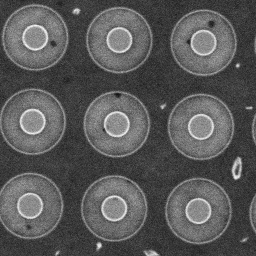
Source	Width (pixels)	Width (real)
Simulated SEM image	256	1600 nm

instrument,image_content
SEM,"an array of small figures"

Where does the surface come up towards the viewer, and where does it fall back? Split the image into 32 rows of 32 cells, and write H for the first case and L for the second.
HHHHHHHHHHHHHHHHHHHHHHHHHHHHHHHH
HHLLLLLHHHHHHLLLLHHHHHHHLLHHHHHH
HLLLLLLLHHHHLLLLLLHHHHHLLLLLHHHH
HLLLHLLLHHHLLLLLLLLHHHLLLLLLLHHH
LLLHHHLLHHHLLLHHLLLHHHLLHHHLLHHH
HLLHHHLLHHHLLHHHLLLHHHLLHHHLLHHH
HLLLLLLLHHHLLLLLLLLHHHLLHHLLLHHH
HHLLLLLHHHHHLLLLLLHHHHLLLLLLLHHH
HHHHLLHHHHHHHLLLLHHHHHHLLLLLHHHH
HHHHHHHHHHHHHHHHHHHHHHHHHHHHHHHH
HHHHHHHHHHHHHHHHHHHHHHHHHHHHHHHH
HHHLLHHHHHHHHHHHHHHHHHHHHHHHHHHH
HLLLLLLHHHHHLLLLLHHHHHHLLLLHHHHH
HLLLLLLLHHHLLLLLLLHHHHLLLLLLHHHH
LLLHHLLLHHHLLHHHLLHHHLLLHHLLLHHH
LLLHHHLLHHHLLHHHLLLHHLLLHHHLLHHH
LLLHHLLLHHHLLHHHLLHHHLLLHHHLLHHH
HLLLLLLHHHHLLLLLLLHHHHLLLLLLLHHH
HHLLLLHHHHHHLLLLLHHHHHLLLLLLHHHH
HHHHHHHHHHHHHHLHHHHHHHHHLLLHHHHH
HHHHHHHHHHHHHHHHHHHHHHHHHHHHHHHH
HHHHHHHHHHHHHHHHHHHHHHHHHHHHHHHH
HLLLLLHHHHHHLLLLHHHHHHHHLLHHHHHH
LLLLLLLHHHHLLLLLLHHHHHLLLLLLHHHH
LLLHHLLHHHHLLLLLLLHHHLLLLLLLHHHH
LLHHHLLLHHLLLHHHLLHHHLLLHHLLLHHH
LLHHHLLLHHLLLHHHLLHHHLLHHHLLLHHL
LLLLLLLHHHHLLLHLLLHHHLLLHHLLLHHL
HLLLLLHHHHHLLLLLLHHHHLLLLLLLHHHH
HHHLLHHHHHHHLLLLHHHHHHLLLLLHHHHH
HHHHHHHHHHHHHHHHHHHHHHHHHHHHHHHH
HHHHHHHHHHHHHHHHHHHHHHHHHHHHHHHH